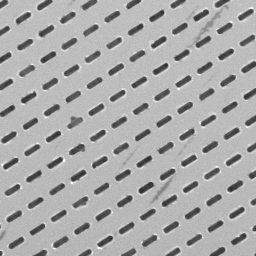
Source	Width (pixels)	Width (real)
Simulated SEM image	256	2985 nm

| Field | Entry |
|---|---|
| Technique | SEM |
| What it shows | a regular array of holes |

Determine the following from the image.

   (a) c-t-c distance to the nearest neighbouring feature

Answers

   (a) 294 nanometres